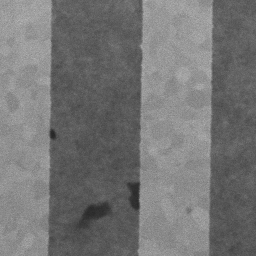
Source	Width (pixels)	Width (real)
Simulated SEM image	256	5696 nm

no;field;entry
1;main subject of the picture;one or a few lines or trenches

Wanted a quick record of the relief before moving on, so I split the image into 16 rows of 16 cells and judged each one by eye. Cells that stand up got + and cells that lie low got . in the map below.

+++......++++...
+++......++++...
+++......++++...
+++......++++...
+++......++++...
+++......++++...
+++......++++...
+++......++++...
+++......++++...
+++......++++...
+++......++++...
+++......++++...
+++......++++...
+++......++++...
+++......++++...
+++......++++...